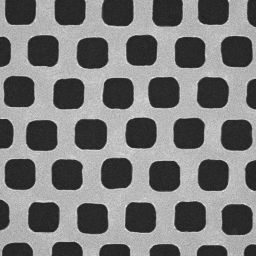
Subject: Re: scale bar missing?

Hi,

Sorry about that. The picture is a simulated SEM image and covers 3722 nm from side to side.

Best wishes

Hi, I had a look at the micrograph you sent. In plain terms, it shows a regular array of holes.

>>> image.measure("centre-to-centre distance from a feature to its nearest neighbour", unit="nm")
679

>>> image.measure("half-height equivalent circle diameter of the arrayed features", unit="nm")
487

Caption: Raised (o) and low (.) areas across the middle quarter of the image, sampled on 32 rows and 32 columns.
oooo......oooooooo...oooooooo...
oooooooooooooooooooooooooooooooo
oooooooooooooooooooooooooooooooo
o..ooooooooo...oooooooo.....oooo
.....ooooo.......oooo.......oooo
.....ooooo.......oooo........ooo
.....ooooo........ooo........ooo
.....ooooo........ooo........ooo
.....ooooo........ooo........ooo
.....ooooo.......oooo........ooo
....oooooo.......ooooo......oooo
.ooooooooooooooooooooooooooooooo
oooooooooooooooooooooooooooooooo
oooooooooooooooooo...oooooooo...
ooo.......oooooo.......ooooo....
ooo........oooo........oooo.....
ooo........oooo........oooo.....
ooo........oooo........oooo.....
ooo........oooo........oooo.....
ooo........oooo........oooo.....
ooo.......oooooo......oooooo....
oooooooo.ooooooooooooooooooooooo
oooooooooooooooooooooooooooooooo
ooooooooooo....ooooooooooooooooo
....oooooo.......oooooo.....oooo
.....oooo........ooooo.......ooo
.....oooo........oooo........ooo
.....oooo........oooo........ooo
.....oooo........oooo........ooo
.....oooo........oooo........ooo
....oooooo......oooooo.......ooo
oooooooooooooooooooooo......oooo